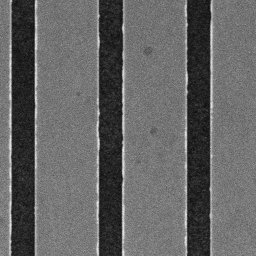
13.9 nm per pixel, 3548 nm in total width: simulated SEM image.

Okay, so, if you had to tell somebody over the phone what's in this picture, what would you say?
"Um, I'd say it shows lines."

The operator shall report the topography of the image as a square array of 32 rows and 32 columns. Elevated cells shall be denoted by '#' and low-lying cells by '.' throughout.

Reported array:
#...########...########...######
#...########...########...######
#...########...########...######
#...########...########...######
#...########...########...######
#...########...########...######
#...########...########...######
#...########...########...######
#...########...########...######
#...########...########...######
#...########...########...######
#...########...########...######
#...########...########...######
#...########...########...######
#...########...########...######
#...########...########...######
#...########...########...######
#...########...########...######
#...########...########...######
#...########...########...######
#...########...########...######
#...########...########...######
#...########...########...######
#...########...########...######
#...########...########...######
#...########...########...######
#...########...########...######
#...########...########...######
#...########...########...######
#...########...########...######
#...########...########...######
#...########...########...######